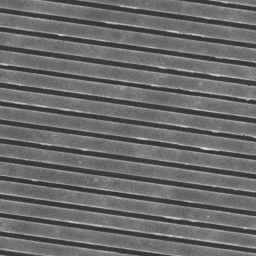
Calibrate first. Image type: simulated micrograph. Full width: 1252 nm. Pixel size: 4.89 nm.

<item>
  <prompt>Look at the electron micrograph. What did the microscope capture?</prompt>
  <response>parallel lines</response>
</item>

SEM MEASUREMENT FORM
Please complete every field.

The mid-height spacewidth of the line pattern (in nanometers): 26.6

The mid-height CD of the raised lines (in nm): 66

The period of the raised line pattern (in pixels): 18.4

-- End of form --